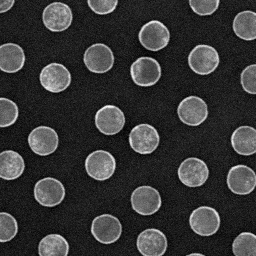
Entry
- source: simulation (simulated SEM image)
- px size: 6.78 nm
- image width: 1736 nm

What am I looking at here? a regular array of raised bodies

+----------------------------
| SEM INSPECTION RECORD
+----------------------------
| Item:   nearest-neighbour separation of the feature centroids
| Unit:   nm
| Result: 331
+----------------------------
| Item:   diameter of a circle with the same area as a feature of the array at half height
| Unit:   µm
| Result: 0.196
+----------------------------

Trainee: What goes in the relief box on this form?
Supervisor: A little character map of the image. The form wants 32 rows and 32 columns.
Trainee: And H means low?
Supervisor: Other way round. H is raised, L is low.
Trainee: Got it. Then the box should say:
HHLLLLHHLLLHHHHLLLLLLLLLHHHLLLLL
LLLLLHHHHLLLHHLLLLLLLLLLHHHLLLHL
LLLLLHHHHLLLLLLLLLLLLLLLLLLLLHHH
LLLLLLHHLLLLLLLLLLHHHLLLLLLLLHHH
LLLLLLLLLLLLLLLLLHHHHLLLLLLLLLHH
LLLLLLLLLLLLLLLLLLHHHLLLLLLLLLLL
HHHLLLLLLLLHHHLLLLLLLLLLHHHLLLLL
HHHLLLLLLLLHHHLLLHHLLLLLHHHLLLLL
HHHLLLHHLLLHHHLLHHHHLLLLHHHLLLLH
LLLLLHHHHLLLLLLLLHHHLLLLLLLLLLHH
LLLLLHHHHLLLLLLLLHHLLLLLLLLLLLHH
LLLLLLLLLLLLLLLLLLLLLLLLLLLLLLLH
HLLLLLLLLLLLLLLLLLLLLLLHHLLLLLLL
HHLLLLLLLLLLLHHLLLLLLLHHHHLLLLLL
HHLLLLLLLLLLHHHLLLLLLLHHHHLLLLLL
HLLLLLLLLLLLHHHLLLLLLLLLHLLLLLLL
LLLLHHHLLLLLLHHLHHHHLLLLLLLLLHHH
LLLLHHHLLLLLLLLLHHHHLLLLLLLLLHHH
LLLLHHHLLLLLLLLLLHHLLLLLLLLLLHHH
HHLLLLLLLLLHHHLLLLLLLLLLLLLLLLLL
HHHLLLLLLLLHHHLLLLLLLLLHHHLLLLLL
HHHLLLLLLLLHHHLLLLLLLLHHHHLLLHHH
LLLLLHHLLLLLLLLLLLLLLLLHHHLLHHHH
LLLLHHHHLLLLLLLLLHHLLLLLLLLLLHHH
LLLLHHHHLLLLLLLLHHHHLLLLLLLLLLLL
LLLLLHHLLLLLLLLLLHHHLLLLLLLLLLLL
LLLLLLLLLLLLLLLLLHHLLLLLHHHLLLLL
HHLLLLLLLLLLHHHLLLLLLLLLHHHLLLLL
HHLLLLLLLLLHHHHLLLLLLLLLHHHLLLLL
HHLLLLHLLLLLHHHLLHHHHLLLLLLLLLHH
LLLLLHHHLLLLLLLLLHHHHLLLLLLLLHHH
LLLLLHHHLLLLLLLLLLHHLLLLLLLLLHHH